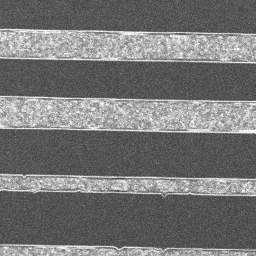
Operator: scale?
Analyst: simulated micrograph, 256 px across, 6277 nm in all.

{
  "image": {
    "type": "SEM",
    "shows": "one or a few lines or trenches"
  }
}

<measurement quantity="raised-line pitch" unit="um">1.72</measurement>